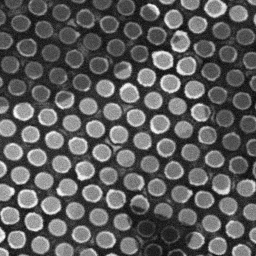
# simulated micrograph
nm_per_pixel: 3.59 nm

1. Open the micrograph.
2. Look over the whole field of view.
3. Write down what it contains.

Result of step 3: a regular array of raised bodies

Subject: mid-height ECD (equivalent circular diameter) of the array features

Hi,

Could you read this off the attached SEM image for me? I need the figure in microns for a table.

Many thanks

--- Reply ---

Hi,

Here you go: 0.0635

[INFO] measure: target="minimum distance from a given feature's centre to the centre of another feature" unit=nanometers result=85.7